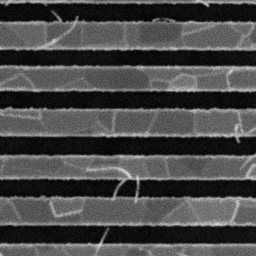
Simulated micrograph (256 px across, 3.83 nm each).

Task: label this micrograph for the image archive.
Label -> lines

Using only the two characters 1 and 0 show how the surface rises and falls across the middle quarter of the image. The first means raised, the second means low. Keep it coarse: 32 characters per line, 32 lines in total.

00000000000000000000000000000000
11111111111111111111111111111111
11111111111111111111111111111111
11111111111111111111111111111111
11111111111111111111111111111111
11111111111111111111111111111111
11011111111111111111111111111111
00000000000000000000000000000000
00000000000000000000000000000000
00000000000000000000000000000000
00000000000000000000000000000000
11111111111111111111111111111100
11111111111111111111111111111111
11111111111111111111111111111111
11111111111111111111111111111111
11111111111111111111111111111111
11111111111111111111111111111111
11111111111111111111111111111111
00000000000000000000000000000000
00000000000000000000000000000000
00000000000000000000000000000000
00000000000000000000000000000000
00000000000000000000000000000000
11111111111111111111111111111111
11111111111111111111111111111111
11111111111111111111111111111111
11111111111111111111111111111111
11111111111111111111111111111111
11111111111111111111111111111111
00000000000000000000000000000000
00000000000000000000000000000000
00000000000000000000000000000000